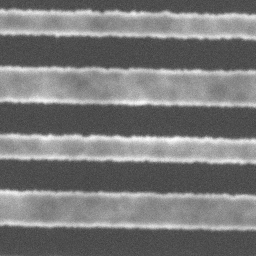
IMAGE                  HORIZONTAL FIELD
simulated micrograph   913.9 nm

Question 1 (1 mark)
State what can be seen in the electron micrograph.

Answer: lines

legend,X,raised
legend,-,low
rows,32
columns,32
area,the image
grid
--------------------------------
XXXXXXXXXXXX-XXXX---X-----------
XXXXXXXXXXXXXXXXXXXXXXXXXXXXXXXX
XXXXXXXXXXXXXXXXXXXXXXXXXXXXXXXX
------------X--XXXXXXXXXXXXXXXXX
--------------------------------
--------------------------------
--------------------------------
XXXXXXXXX-XXX-------------------
XXXXXXXXXXXXXXXXXXXXXXXXXXXXXXXX
XXXXXXXXXXXXXXXXXXXXXXXXXXXXXXXX
XXXXXXXXXXXXXXXXXXXXXXXXXXXXXXXX
XXXXXXXXXXXXXXXXXXXXXXXXXXXXXXXX
--------------------------------
--------------------------------
--------------------------------
--------------------------------
XXXXXXXXXXXXXXXXXXXXXXXXXXXXX-XX
XXXXXXXXXXXXXXXXXXXXXXXXXXXXXXXX
XXXXXXXXXXXXXXXXXXXXXXXXXXXXXXXX
--------------------------------
--------------------------------
--------------------------------
--------------------------------
XXXXXXXXXXXXXXXXXXXXXXXXXXXXXXXX
XXXXXXXXXXXXXXXXXXXXXXXXXXXXXXXX
XXXXXXXXXXXXXXXXXXXXXXXXXXXXXXXX
XXXXXXXXXXXXXXXXXXXXXXXXXXXXXXXX
-------------------X-XXXXXXXXXXX
--------------------------------
--------------------------------
--------------------------------